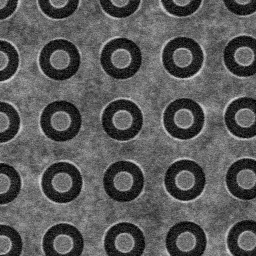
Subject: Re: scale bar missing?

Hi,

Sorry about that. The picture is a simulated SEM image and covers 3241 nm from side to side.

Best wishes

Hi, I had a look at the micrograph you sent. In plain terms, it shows an array of small figures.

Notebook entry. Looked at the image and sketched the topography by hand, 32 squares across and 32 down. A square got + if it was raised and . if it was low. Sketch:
..+++.....++......++.....+++....
..+++....++++....++++...+++++...
++++++++++++++++++++++++++++++++
++++++++++++++++++++++++++++++++
++++++++++++++++++++++++++++++.+
.+++++...++++....++++....+++....
..+++.....+++.....++.....+++....
..+++.....+++.....++......++....
..+++.....+++....++++....+++....
..++++...+++++...+++++..+++++..+
++++++++++++++++++++++++++++++++
++++++++++++++++++++++++++++++++
++++++++++++++..++++++..+++++...
..++++....+++....++++....+++....
..+++.....+++.....++......++....
...++.....+++.....++......++....
..+++.....+++....++++....++++...
.+++++...+++++..++++++++++++++++
++++++++++++++++++++++++++++++++
++++++++++++++++++++++++++++++++
.++++++..+++++...++++....++++...
..+++.....+++.....+++....+++....
...++.....+++.....++......++....
...++.....+++.....+++.....++....
..++++....++++...++++....++++...
.+++++++++++++++++++++++++++++++
++++++++++++++++++++++++++++++++
++++++++++++++++++++++++++++++++
..++++....++++...++++....++++...
...++.....+++.....+++.....++....
...++.....+++.....+++.....++....
...++.....+++.....+++.....+++...